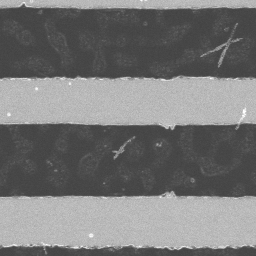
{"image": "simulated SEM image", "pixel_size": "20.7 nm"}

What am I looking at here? one or a few lines or trenches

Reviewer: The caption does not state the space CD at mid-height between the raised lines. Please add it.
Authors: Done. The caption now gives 997 nanometers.